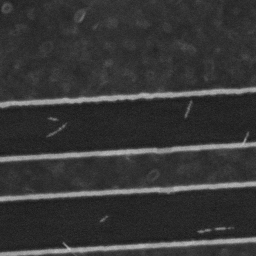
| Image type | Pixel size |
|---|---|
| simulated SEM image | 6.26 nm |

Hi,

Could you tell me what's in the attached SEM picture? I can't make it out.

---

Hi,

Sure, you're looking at one or a few lines or trenches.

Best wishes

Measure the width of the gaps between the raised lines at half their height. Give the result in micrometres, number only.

0.34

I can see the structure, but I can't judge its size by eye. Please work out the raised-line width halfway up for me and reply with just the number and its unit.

248 nm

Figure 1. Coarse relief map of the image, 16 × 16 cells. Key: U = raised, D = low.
UUUUUUUUUUUUUUUU
UUUUUUUUUUUUUUUU
UUUUUUUUUUUUUUUU
UUUUUUUUUUUUUUUU
UUUUUUUUUUUUUUUU
UUUUUUUUUUUUUUUU
UDDDDDDDDDDDDDDD
DDDDDDDDDDDDDDDD
DDDDDDDDDDDDDDDD
DDDDDDDDUUUUUUUU
UUUUUUUUUUUUUUUU
UUUUUUUUUUUUUUUU
DDDDDDDDDDDDDDDD
DDDDDDDDDDDDDDDD
DDDDDDDDDDDDDDDD
DDDDDDDUUUUUUUUU